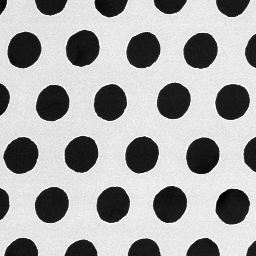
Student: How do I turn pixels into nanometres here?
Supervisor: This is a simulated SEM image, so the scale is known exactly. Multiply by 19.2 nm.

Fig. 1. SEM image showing a regular array of holes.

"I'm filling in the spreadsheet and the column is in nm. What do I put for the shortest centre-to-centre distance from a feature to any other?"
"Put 1110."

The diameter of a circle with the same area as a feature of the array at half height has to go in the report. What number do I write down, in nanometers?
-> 686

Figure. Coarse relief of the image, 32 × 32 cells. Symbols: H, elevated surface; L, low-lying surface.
LHHHLLLLHHHHLLLLHHHLLLLHHHHLLLLH
HHHHHLLLHHHHLLLHHHHHLLHHHHHHLLHH
HHHHHHHHHHHHHHHHHHHHHHHHHHHHHHHH
HHHHHHHHHHHHHHHHHHHHHHHHHHHHHHHH
HHLLLHHHHLLLHHHHHLLHHHHHLLLHHHHH
HLLLLHHHLLLLHHHHLLLLHHHLLLLHHHHL
HLLLLHHHLLLLHHHHLLLLHHHLLLLHHHHL
HLLLLHHHHLLLHHHHLLLLHHHLLLLHHHHL
HHHHHHHHHHHHHHHHHLHHHHHHLLHHHHHH
HHHHHHHHHHHHHHHHHHHHHHHHHHHHHHHH
HHHHHHHHHHHHHHHHHHHHHLLHHHHHHHHH
LHHHHLLLHHHHLLLLHHHHLLLLHHHLLLLH
LHHHHLLLLHHHLLLLHHHHLLLLHHHLLLLH
LHHHHLLLLHHHLLLLHHHHLLLLHHHLLLLH
HHHHHLLLHHHHLLLHHHHHLLLHHHHHLLHH
HHHHHHHHHHHHHHHHHHHHHHHHHHHHHHHH
HHHHHHHHHHHHHHHHHHHHHHHHHHHHHHHH
HHLLHHHHHLLLHHHHHLLHHHHHLLLHHHHL
HLLLLHHHLLLLHHHHLLLLHHHLLLLHHHHL
LLLLLHHHLLLLHHHHLLLLHHHLLLLHHHLL
HLLLHHHHLLLLHHHHLLLLHHHLLLLHHHHL
HHLLHHHHHLLHHHHHHLHHHHHHLLHHHHHH
HHHHHHHHHHHHHHHHHHHHHHHHHHHHHHHH
HHHHHHLHHHHHHLLHHHHHLLHHHHHHHHHH
LHHHHLLLHHHHLLLLHHHLLLLHHHHLLLLH
LHHHLLLLLHHHLLLLHHHLLLLHHHHLLLLH
LHHHLLLLHHHHLLLLHHHLLLLHHHHLLLLH
HHHHHLLLHHHHHLLHHHHHLLHHHHHHLLHH
HHHHHHHHHHHHHHHHHHHHHHHHHHHHHHHH
HHHHHHHHHHHHHHHHHHHHHHHHHHHHHHHH
HLLLHHHHHLLLHHHHHLLLHHHHLLLHHHHL
HLLLLHHHLLLLHHHHLLLLHHHLLLLHHHHL